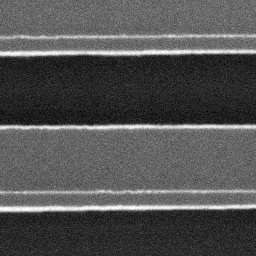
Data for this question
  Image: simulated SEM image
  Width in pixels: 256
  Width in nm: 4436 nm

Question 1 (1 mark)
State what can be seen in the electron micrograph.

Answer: lines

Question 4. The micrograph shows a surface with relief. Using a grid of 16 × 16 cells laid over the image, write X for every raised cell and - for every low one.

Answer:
XXXXXXXXXXXXXXXX
XXXXXXXXXXXXXXXX
XXXXXXXXXXXXXXXX
----------------
----------------
----------------
----------------
----------------
XXXXXXXXXXXXXXXX
XXXXXXXXXXXXXXXX
XXXXXXXXXXXXXXXX
XXXXXXXXXXXXXXXX
XXXXXXXXXXXXXXXX
----------------
----------------
----------------